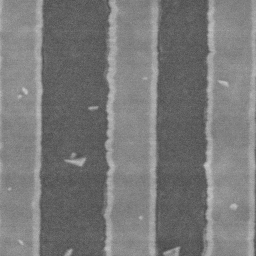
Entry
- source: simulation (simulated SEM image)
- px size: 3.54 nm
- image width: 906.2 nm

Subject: lines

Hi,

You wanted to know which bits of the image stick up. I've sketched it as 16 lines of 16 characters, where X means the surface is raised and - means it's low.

XXX----XXX---XXX
XXX----XXX---XXX
XXX----XXX---XXX
XXX----XXX---XXX
XXX----XXX---XXX
XXX----XXX---XXX
XXX----XXX---XXX
XXX----XXX---XXX
XXX----XXX---XXX
XXX----XXX---XXX
XX-----XXX---XXX
XX-----XXX---XXX
XX-----XXX---XXX
XX-----XXX---XXX
XX-----XXX---XXX
XX-----XXX---XXX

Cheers